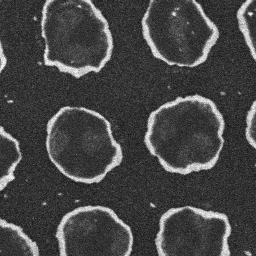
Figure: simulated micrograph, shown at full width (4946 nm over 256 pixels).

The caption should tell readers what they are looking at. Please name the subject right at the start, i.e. raised bodies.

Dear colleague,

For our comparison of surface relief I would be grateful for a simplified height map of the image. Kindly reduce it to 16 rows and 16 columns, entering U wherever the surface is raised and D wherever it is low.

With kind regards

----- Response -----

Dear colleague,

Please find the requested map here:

DDDUUUDDDUUUDDDU
DDDUUUUDDUUUUDDU
DDDUUUUDDUUUUDDU
DDDUUUUDDDUUUDDD
DDDDDDDDDDDDDDDD
DDDDDDDDDDDDDDDD
DDDDDDDDDDDUUDDD
DDDUUUDDDUUUUUDD
UDDUUUUDDUUUUUDD
UDDUUUUDDDUUUUDD
UDDDUUUDDDDUDDDD
DDDDDDDDDDDDDDDD
DDDDDDDDDDDDDDDD
DDDDUUUDDDUUUUDD
UDDDUUUUDDUUUUDD
UUDDUUUUDDUUUUDD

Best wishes